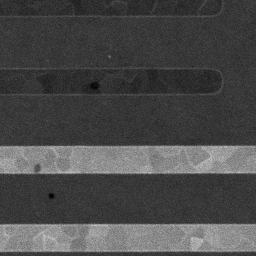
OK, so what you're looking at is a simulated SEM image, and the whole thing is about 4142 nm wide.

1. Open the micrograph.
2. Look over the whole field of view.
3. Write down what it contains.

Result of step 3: groups of lines, slits or small figures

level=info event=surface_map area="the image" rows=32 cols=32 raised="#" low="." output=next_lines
############################....
############################....
................................
................................
................................
................................
................................
................................
................................
############################....
############################....
###########################.....
................................
................................
................................
................................
................................
................................
################################
################################
################################
################################
................................
................................
................................
................................
................................
................................
################################
################################
################################
................................